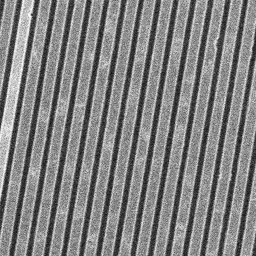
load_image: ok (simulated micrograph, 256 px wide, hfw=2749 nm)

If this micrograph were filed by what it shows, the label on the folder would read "parallel lines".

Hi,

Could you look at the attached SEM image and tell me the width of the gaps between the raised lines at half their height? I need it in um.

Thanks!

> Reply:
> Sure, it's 0.0662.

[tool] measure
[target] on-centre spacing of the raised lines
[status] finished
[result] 0.184 um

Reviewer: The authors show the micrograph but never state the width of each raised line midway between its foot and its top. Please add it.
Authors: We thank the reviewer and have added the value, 115 nanometers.